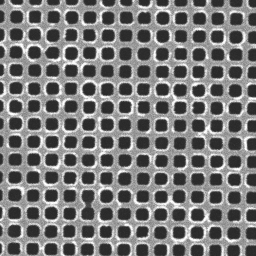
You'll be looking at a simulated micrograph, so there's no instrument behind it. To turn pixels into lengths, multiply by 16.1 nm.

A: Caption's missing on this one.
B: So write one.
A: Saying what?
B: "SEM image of a regular array of holes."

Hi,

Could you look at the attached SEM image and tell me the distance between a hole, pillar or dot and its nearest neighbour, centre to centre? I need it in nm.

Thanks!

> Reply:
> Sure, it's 286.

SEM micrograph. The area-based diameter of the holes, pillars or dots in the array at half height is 228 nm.